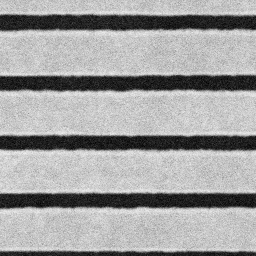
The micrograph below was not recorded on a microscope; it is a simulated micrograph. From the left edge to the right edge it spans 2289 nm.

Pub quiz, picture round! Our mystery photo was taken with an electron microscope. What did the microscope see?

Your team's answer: lines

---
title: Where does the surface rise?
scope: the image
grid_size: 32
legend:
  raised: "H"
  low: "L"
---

HHHHHHHHHHHHHHHHHHHHHHHHHHHHHHHH
HHHHHHHHHHHHHHHHHHHHHHHHHHHHHHHH
LLLLLLLLLLLLLLLLLLLLLLLLLLLLLLLL
LLLLLLLLLLLLLLLLLLLLLLLLLLLLLLLL
HHHHHHHHHHHHHHHHHHHHHHHHHHHHHHHH
HHHHHHHHHHHHHHHHHHHHHHHHHHHHHHHH
HHHHHHHHHHHHHHHHHHHHHHHHHHHHHHHH
HHHHHHHHHHHHHHHHHHHHHHHHHHHHHHHH
HHHHHHHHHHHHHHHHHHHHHHHHHHHHHHHH
LLLLLLLLLLLLLLLLLLLLLLLLLLLLLLLL
LLLLLLLLLLLLLLLLLLLLLLLLLLLLLLLL
HHHHHHHHHHHHHHHHHHHHHHHHHHHHHHHH
HHHHHHHHHHHHHHHHHHHHHHHHHHHHHHHH
HHHHHHHHHHHHHHHHHHHHHHHHHHHHHHHH
HHHHHHHHHHHHHHHHHHHHHHHHHHHHHHHH
HHHHHHHHHHHHHHHHHHHHHHHHHHHHHHHH
HHHHHHHHHHHHHHHHHHHHHHHHHHHHHHHH
LLLLLLLLLLLLLLLLLLLLLLLLLLLLLLLL
LLLLLLLLLLLLLLLLLLLLLLLLLLLLLLLL
HHHHHHHHHHHHHHHHHHHHHHHHHHHHHHHH
HHHHHHHHHHHHHHHHHHHHHHHHHHHHHHHH
HHHHHHHHHHHHHHHHHHHHHHHHHHHHHHHH
HHHHHHHHHHHHHHHHHHHHHHHHHHHHHHHH
HHHHHHHHHHHHHHHHHHHHHHHHHHHHHHHH
LLLLLLLLLLLLLLLLLLLLLLLLLLLLLLLL
LLLLLLLLLLLLLLLLLLLLLLLLLLLLLLLL
HHHHHHHHHHHHHHHHHHHHHHHHHHHHHHHH
HHHHHHHHHHHHHHHHHHHHHHHHHHHHHHHH
HHHHHHHHHHHHHHHHHHHHHHHHHHHHHHHH
HHHHHHHHHHHHHHHHHHHHHHHHHHHHHHHH
HHHHHHHHHHHHHHHHHHHHHHHHHHHHHHHH
LLLLLLLLLLLLLLLLLLLLLLLLLLLLLLLL